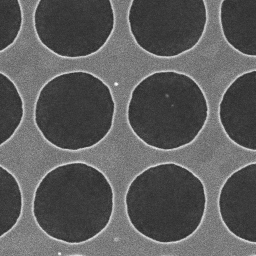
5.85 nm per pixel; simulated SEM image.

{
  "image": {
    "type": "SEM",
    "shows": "holes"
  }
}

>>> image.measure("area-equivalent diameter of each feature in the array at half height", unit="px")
78.9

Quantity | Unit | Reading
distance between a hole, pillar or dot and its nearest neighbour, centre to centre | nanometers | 541